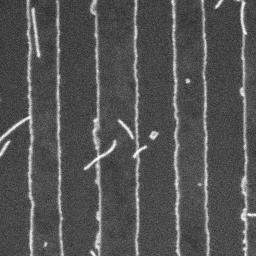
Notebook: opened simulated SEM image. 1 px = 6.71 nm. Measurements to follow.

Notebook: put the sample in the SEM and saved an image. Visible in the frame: lines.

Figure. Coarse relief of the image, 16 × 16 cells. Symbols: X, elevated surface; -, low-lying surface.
--XX--XXX--XX--X
--XX--XXX--XX--X
--XX--XXX--XX--X
--XX--XXX--XX--X
--XX--XXX--XX--X
--XX--XXX--XX--X
--XX--XXX--XX--X
--XX--XXX--XX--X
--XX--XXX--XX--X
--XX--XXX--XX--X
--XX--XXX--XX--X
--XX--XXX--XX--X
--XX--XXX--XX--X
--XX--XXX--XX--X
--XX--XXX--XX--X
--XX--XXX--XX--X